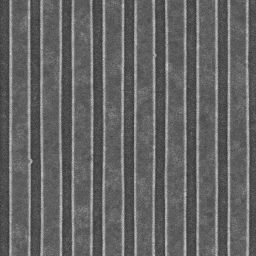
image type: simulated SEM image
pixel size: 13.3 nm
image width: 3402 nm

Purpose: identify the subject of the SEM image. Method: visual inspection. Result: parallel lines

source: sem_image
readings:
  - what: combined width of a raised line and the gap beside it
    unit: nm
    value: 414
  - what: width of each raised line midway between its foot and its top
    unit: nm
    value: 259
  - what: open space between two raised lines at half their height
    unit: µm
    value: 0.164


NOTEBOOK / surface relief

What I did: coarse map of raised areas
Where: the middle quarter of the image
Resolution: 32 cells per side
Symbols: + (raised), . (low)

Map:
..+++++...+++++...+++++...++++..
..+++++...+++++...+++++...++++..
..+++++...+++++...+++++...++++..
..+++++...+++++...+++++...++++..
..+++++...+++++...+++++...++++..
..+++++...+++++...+++++...++++..
..+++++...+++++...+++++...++++..
..+++++...+++++...+++++...++++..
..+++++...+++++...+++++...++++..
..+++++...+++++...+++++...++++..
..+++++...+++++...+++++...++++..
..+++++...+++++...+++++...++++..
..+++++...+++++...+++++...++++..
..+++++...+++++...+++++...++++..
..+++++...+++++...+++++...++++..
..+++++...+++++...+++++...++++..
..+++++...+++++...+++++...++++..
..+++++...+++++...+++++...++++..
..+++++...+++++...+++++...++++..
..+++++...+++++...+++++...++++..
..+++++...+++++...+++++...++++..
..+++++...+++++...+++++...++++..
..+++++...+++++...+++++...++++..
..+++++...+++++...+++++...++++..
..+++++...+++++...+++++...++++..
..+++++...+++++...+++++...++++..
..+++++...+++++...+++++...++++..
..+++++...+++++...+++++...++++..
..+++++...+++++...++++....++++..
..+++++...+++++...++++....++++..
..+++++...+++++...++++....++++..
..+++++...+++++...++++....++++..